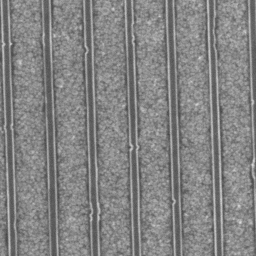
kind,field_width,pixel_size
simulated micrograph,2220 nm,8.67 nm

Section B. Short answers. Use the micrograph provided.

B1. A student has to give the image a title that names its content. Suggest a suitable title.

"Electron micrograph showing parallel lines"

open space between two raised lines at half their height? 290 nanometres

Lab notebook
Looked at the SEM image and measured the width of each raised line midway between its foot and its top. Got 63.9 nm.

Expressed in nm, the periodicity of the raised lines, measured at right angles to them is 357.